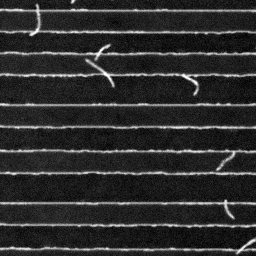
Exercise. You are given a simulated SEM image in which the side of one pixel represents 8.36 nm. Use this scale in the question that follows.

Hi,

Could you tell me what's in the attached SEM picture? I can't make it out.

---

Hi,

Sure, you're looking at lines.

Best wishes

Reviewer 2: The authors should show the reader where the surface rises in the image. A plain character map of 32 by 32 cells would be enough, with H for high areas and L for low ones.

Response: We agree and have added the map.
LLLLLLLLLLLLLLLLLLLLLLLLLLLLLLLL
HHHHHHHHHHHHHHHHHHHHHHHHHHHHHHHH
HHHHHHHHHHHHHHHHHHHHHHHHHHHHHHHH
HHHHHHHHHHHHHHHHHHHHHHHHHHHHHHHH
LLLLLLLLLLLLLLLLLLLLLLLLLLLLLLLL
LLLLLLLLLLLLLLLLLLLLLLLLLLLLLLLL
LLLLLLLLLLLLLLLLLLLLLLLLLLLLLLLL
HHHHHHHHHHHHHHHHHHHHHHHHHHHHHHHH
HHHHHHHHHHHHHHHHHHHHHHHHHHHHHHHH
LLLLLLLLLLLLLHLLLLLLLLLHLLLLLLLL
LLLLLLLLLLLLLLLLLLLLLLLLLLLLLLLL
LLLLLLLLLLLLLLLLLLLLLLLLLLLLLLLL
LLLLLLLLLLLLLLLLLLLLLLLLLLLLLLLL
HHHHHHHHHHHHHHHHHHHHHHHHHHHHHHHH
HHHHHHHHHHHHHHHHHHHHHHHHHHHHHHHH
HHHHHHHHHHHHHHHHHHHHHHHHHHHHHHHH
LLLLLLLLLLLLLLLLLLLLLLLLLLLLLLLL
LLLLLLLLLLLLLLLLLLLLLLLLLLLLLLLL
LLLLLLLLLLLLLLLLLLLLLLLLLLLLLLLL
HHHHHHHHHHHHHHHHHHHHHHHHHHHHHHHH
HHHHHHHHHHHHHHHHHHHHHHHHHHHHHHHH
HHHHHHHHHHHHHHHHHHHHHHHHHHHHHHHH
LLLLLLLLLLLLLLLLLLLLLLLLLLLLLLLL
LLLLLLLLLLLLLLLLLLLLLLLLLLLLLLLL
LLLLLLLLLLLLLLLLLLLLLLLLLLLLLLLL
HHHHHHHHHHHHHHHHHHHHHHHHHHHHHHHH
HHHHHHHHHHHHHHHHHHHHHHHHHHHHHHHH
HHHHHHHHHHHHHHHHHHHHHHHHHHHHHHHH
LLLLLLLLLLLLLLLLLLLLLLLLLLLLLLLL
LLLLLLLLLLLLLLLLLLLLLLLLLLLLLLLL
LLLLLLLLLLLLLLLLLLLLLLLLLLLLLLLL
HHHHHHHHHHHHHHHHHHHHHHHHHHHHHHHH